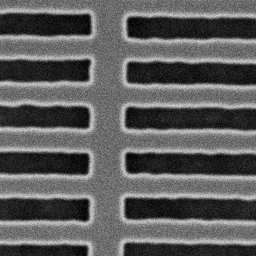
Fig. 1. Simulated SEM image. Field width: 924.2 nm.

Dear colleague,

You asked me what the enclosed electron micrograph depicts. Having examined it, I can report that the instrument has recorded groups of lines, slits or small figures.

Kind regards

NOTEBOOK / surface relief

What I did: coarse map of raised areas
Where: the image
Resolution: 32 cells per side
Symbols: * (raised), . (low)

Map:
********************************
*..*****************************
............****................
............****................
...........*****................
********************************
********************************
...........*********************
...........*****................
...........*****................
*****************...............
********************************
********************************
...........*****............**..
...........****.................
...........****.................
********************************
********************************
********************************
...........*****................
...........*****................
...........*****................
********************************
********************************
********************************
...........****.................
...........****.................
...........*****..****..........
********************************
********************************
.**.************..............**
...........****.................